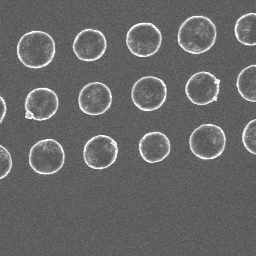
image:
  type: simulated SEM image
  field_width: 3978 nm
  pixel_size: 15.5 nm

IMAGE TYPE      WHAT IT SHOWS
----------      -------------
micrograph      a regular array of raised bodies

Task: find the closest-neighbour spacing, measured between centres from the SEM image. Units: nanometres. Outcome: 832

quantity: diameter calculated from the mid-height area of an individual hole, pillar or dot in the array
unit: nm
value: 529